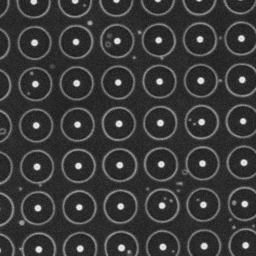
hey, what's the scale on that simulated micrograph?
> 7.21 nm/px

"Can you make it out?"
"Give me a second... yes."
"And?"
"an array of small figures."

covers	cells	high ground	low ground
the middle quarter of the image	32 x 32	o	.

ooooooooooooooooooooooo.oooooooo
o....oooooo.....ooooo......oooo.
......oooo.......ooo.......oooo.
.......ooo.......ooo........oo..
...o...ooo...o....oo...o....oo..
.......ooo.......ooo........ooo.
.......ooo.......oooo......oooo.
......ooooo.....oooooo....oooooo
oo...oooooooo.oooooooooooooooooo
oooooooooooooooooooooooooooooooo
oooooooooooooooooooooooooooooooo
oo...ooooooo....oooooo....oooooo
o.....ooooo......oooo......oooo.
.......ooo.......ooo........ooo.
.......ooo...o....oo....o...oo..
...o...ooo...o....oo........ooo.
.......ooo.......oooo.......ooo.
.......oooo......oooo......ooooo
o....ooooooo...oooooooo...oooooo
oooooooooooooooooooooooooooooooo
oooooooooooooooooooooooooooooooo
ooo.ooooooooo..oooooooo...oooooo
o.....ooooo......oooo......oooo.
.......ooo........ooo.......ooo.
.......ooo........oo........ooo.
...o....oo...o....oo....o...ooo.
.......ooo........ooo.......ooo.
.......oooo......oooo......ooooo
o.....oooooo....oooooo....oooooo
oooooooooooooooooooooooooooooooo
oooooooooooooooooooooooooooooooo
oooooooooooooooooooooooo.ooooooo